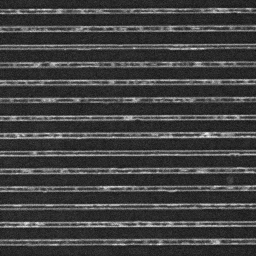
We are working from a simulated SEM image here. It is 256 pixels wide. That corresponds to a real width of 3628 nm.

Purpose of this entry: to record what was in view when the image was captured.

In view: parallel lines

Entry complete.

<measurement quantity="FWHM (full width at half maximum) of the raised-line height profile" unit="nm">63.8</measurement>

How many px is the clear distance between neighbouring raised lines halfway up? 13.4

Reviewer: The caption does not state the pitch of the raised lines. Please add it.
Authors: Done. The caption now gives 0.252 µm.